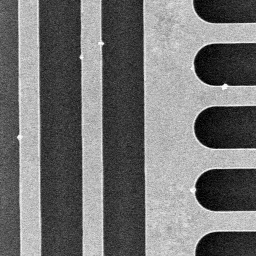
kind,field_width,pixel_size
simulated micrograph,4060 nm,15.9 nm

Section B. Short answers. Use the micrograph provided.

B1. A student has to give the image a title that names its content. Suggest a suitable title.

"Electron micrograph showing groups of lines, slits or small figures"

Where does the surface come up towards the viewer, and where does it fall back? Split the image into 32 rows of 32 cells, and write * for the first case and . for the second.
..***.....***.....******........
..***.....***.....******........
..***.....***.....*******.......
..***.....***.....**************
..***.....***.....**************
..***.....***.....********......
..***.....***.....*******.......
..***.....***.....******........
..***.....***.....******........
..***.....***.....*******.......
..***.....***.....********......
...**.....***.....**************
...**.....***.....**************
...**.....***.....********......
...**.....***.....*******.......
...**.....***.....******........
..***.....***.....******........
..***.....***.....*******.......
...**.....***.....********......
...**.....***.....**************
...**.....***.....**************
...**.....***.....********......
...**.....***.....*******.......
...**.....***.....******........
...**.....***.....******........
...**.....***.....*******.......
...**.....***.....*********.****
...**.....***.....**************
...**.....***.....**************
...**.....***.....*******.......
...**.....***.....*******.......
...**.....***.....******........